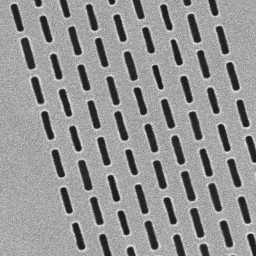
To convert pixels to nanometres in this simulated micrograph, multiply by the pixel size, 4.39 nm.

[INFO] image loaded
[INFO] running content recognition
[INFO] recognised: a regular array of holes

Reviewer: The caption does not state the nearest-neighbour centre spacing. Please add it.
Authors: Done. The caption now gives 130 nm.